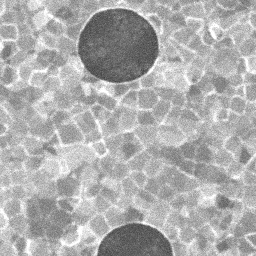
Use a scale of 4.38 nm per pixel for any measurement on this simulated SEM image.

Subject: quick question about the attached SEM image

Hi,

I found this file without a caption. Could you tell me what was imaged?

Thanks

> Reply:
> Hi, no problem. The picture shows holes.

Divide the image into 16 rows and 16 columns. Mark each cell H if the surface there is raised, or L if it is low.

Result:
HHHHHHHHHHHHHHHH
HHHHHLLLLHHHHHHH
HHHHHLLLLLHHHHHH
HHHHHLLLLLHHHHHH
HHHHHHLLLHHHHHHH
HHHHHHHHHHHHHHHH
HHHHHHHHHHHHHHHH
HHHHHHHHHHHHHHHH
HHHHHHHHHHHHHHHH
HHHHHHHHHHHHHHHH
HHHHHHHHHHHHHHHH
HHHHHHHHHHHHHHHH
HHHHHHHHHHHHHHHH
HHHHHHHHHHHHHHHH
HHHHHHHLLLHHHHHH
HHHHHHLLLLLHHHHH